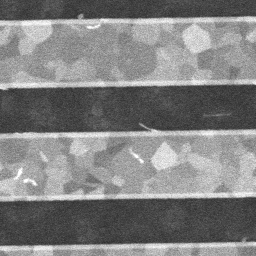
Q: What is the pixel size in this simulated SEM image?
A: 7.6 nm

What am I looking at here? one or a few lines or trenches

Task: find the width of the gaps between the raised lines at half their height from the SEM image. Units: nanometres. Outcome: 380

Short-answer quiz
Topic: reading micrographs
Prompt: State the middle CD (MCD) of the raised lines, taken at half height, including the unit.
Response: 477 nm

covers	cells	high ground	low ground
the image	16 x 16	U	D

DDDDDDDDDDDDDDDD
UUUUUUUUUUUUUUUU
UUUUUUUUUUUUUUUU
UUUUUUUUUUUUUUUU
UUUUUUUUUUUUUUUU
DDDDDDDDDDDDDDDD
DDDDDDDDDDDDDDDD
DDDDDDDDDDDDDDDD
UUUUUUUUUUUUUUUU
UUUUUUUUUUUUUUUU
UUUUUUUUUUUUUUUU
UUUUUUUUUUUUUUUU
DDDDDDDDDDDDDDDD
DDDDDDDDDDDDDDDD
DDDDDDDDDDDDDDDD
DDDUUUUUUUUUUUUU